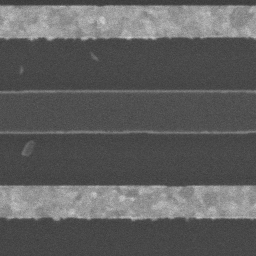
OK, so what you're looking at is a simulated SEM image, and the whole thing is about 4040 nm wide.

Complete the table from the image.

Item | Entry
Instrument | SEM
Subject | lines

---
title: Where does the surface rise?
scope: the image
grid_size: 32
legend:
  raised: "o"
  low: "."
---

................................
oooooooooooooooooooooooooooooooo
oooooooooooooooooooooooooooooooo
oooooooooooooooooooooooooooooooo
oooooooooooooooooooooooooooooooo
................................
................................
................................
................................
................................
................................
oooooooooooooooooooooooooooooooo
oooooooooooooooooooooooooooooooo
oooooooooooooooooooooooooooooooo
oooooooooooooooooooooooooooooooo
oooooooooooooooooooooooooooooooo
oooooooooooooooooooooooooooooooo
................................
................................
................................
................................
................................
................................
oooooooooooooooooooooooooooooooo
oooooooooooooooooooooooooooooooo
oooooooooooooooooooooooooooooooo
oooooooooooooooooooooooooooooooo
................................
................................
................................
................................
................................